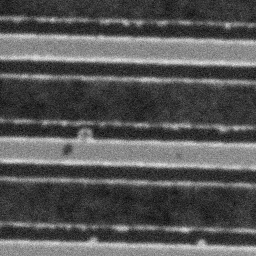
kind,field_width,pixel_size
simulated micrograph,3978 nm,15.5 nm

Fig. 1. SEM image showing lines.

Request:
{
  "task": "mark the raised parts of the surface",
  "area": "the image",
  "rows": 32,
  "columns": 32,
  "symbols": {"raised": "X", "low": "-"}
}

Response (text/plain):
XXXXXXXXXXXXXXXXXXXXXXXXXXXXXXXX
XXXXXXXXXXXXXXXXXXXXXXXXXXXXXXXX
----------XXXXXXXXXXXXXXXXXXXXXX
--------------------------------
XXX-----------------------------
XXXXXXXXXXXXXXXXXXXXXXXXXXXXXXXX
XXXXXXXXXXXXXXXXXXXXXXXXXXXXXXXX
-----------XXXXXXXXXXXXXXXXXXXXX
--------------------------------
XXX-----------------------------
XXXXXXXXXXXXXXXXXXXXXXXXXXXXXXXX
XXXXXXXXXXXXXXXXXXXXXXXXXXXXXXXX
XXXXXXXXXXXXXXXXXXXXXXXXXXXXXXXX
XXXXXXXXXXXXXXXXXXXXXXXXXXXXXXXX
XXXXXXXXXXXXXXXXXXXXXXXXXXXXXXXX
--------------XXXXXXXXXXXXXXXXXX
----------X---------------------
XXXXXXX--XXX--------------------
XXXXXXXXXXXXXXXXXXXXXXXXXXXXXXXX
XXXXXXXXXXXXXXXXXXXXXXXXXXXXXXXX
-------------XXXXXXXXXXXXXXXXXXX
--------------------------------
XXXXXXXXX-----------------------
XXXXXXXXXXXXXXXXXXXXXXXXXXXXXXXX
XXXXXXXXXXXXXXXXXXXXXXXXXXXXXXXX
XXXXXXXXXXXXXXXXXXXXXXXXXXXXXXXX
XXXXXXXXXXXXXXXXXXXXXXXXXXXXXXXX
XXXXXXXXXXXXXXXXXXXXXXXXXXXXXXXX
------------------XXXXXXXXXXXXXX
--------------------------------
XXXXXXXXXX-X--------------------
XXXXXXXXXXXXXXXXXXXXXXXXXXXXXXXX